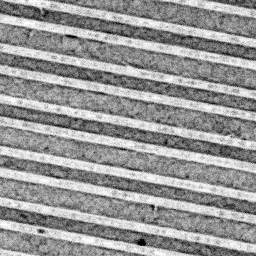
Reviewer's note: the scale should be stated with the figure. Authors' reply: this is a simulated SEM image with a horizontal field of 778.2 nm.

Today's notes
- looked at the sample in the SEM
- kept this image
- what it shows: parallel lines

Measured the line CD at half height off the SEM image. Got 20.5 nm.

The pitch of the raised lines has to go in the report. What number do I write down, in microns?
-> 0.0766